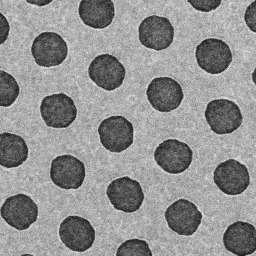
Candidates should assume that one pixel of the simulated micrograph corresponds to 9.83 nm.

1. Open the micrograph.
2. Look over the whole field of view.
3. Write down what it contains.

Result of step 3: a regular array of holes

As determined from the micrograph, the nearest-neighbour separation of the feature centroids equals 606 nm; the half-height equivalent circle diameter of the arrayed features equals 358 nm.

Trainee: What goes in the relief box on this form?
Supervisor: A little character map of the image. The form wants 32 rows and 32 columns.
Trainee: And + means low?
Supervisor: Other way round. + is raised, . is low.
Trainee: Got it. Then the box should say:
++++..++++....++++++++++....+++.
++++++++++....+++++++++++.+++++.
.+++++++++....++++...++++++++++.
.++++++++++..++++.....+++++++++.
.++++...+++++++++.....++++++++++
++++....++++++++++...++++...++++
++++....++++++++++++++++.....+++
++++....++++...++++++++++....+++
+++++++++++.....+++++++++...++++
..+++++++++.....+++++++++++++++.
..++++++++++...++++...++++++++++
..++++++++++++++++.....+++++++++
..+++....+++++++++.....++++..+++
+++++.....+++++++++...++++....++
+++++.....++++.+++++++++++....++
++++++...++++...++++++++++....++
++++++++++++.....++++++++++..+++
...++++++++++....++++.++++++++++
...++++++++++...++++....++++++++
...++++..++++++++++.....++++++++
...+++....++++++++++....+++...++
++++++.....++++++++++..++++....+
++++++.....+++...++++++++++....+
++++++++..+++.....+++++++++....+
++..+++++++++.....++++++++++++++
....++++++++++....+++...++++++++
.....+++++++++++.++++....+++++++
+....+++...++++++++++....+++++++
++.++++.....+++++++++....+++....
+++++++.....++++++++++++++++....
++++++++....+++....+++++++++....
+++++++++++++++....++++++++++...